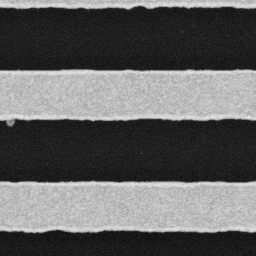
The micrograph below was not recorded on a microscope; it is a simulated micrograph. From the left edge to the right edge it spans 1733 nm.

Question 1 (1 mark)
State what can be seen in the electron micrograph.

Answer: lines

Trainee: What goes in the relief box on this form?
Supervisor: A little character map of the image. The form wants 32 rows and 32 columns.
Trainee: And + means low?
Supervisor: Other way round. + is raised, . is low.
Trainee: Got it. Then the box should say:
++++++++++++++++++++++++++++++++
................................
................................
................................
................................
................................
................................
................................
................................
++++++++++++++++++++++++++++++++
++++++++++++++++++++++++++++++++
++++++++++++++++++++++++++++++++
++++++++++++++++++++++++++++++++
++++++++++++++++++++++++++++++++
++++++++++++++++++++++++++++++++
................................
................................
................................
................................
................................
................................
................................
................................
++++++++++++++++++++++++++++++++
++++++++++++++++++++++++++++++++
++++++++++++++++++++++++++++++++
++++++++++++++++++++++++++++++++
++++++++++++++++++++++++++++++++
++++++++++++++++++++++++++++++++
................................
................................
................................